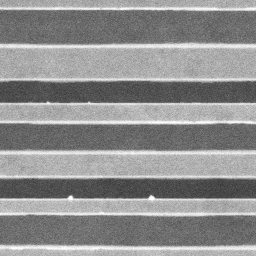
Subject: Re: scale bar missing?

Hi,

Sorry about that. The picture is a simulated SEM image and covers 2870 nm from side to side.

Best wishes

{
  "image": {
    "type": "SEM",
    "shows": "lines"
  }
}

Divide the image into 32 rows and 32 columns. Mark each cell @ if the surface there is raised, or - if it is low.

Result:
@@@@@@@@@@@@@@@@@@@@@@@@@@@@@@@@
--------------------------------
--------------------------------
--------------------------------
--------------------------------
--------------------------------
@@@@@@@@@@@@@@@@@@@@@@@@@@@@@@@@
@@@@@@@@@@@@@@@@@@@@@@@@@@@@@@@@
@@@@@@@@@@@@@@@@@@@@@@@@@@@@@@@@
@@@@@@@@@@@@@@@@@@@@@@@@@@@@@@@@
--------------------------------
--------------------------------
--------------------------------
@@@@@@@@@@@@@@@@@@@@@@@@@@@@@@@@
@@@@@@@@@@@@@@@@@@@@@@@@@@@@@@@@
--------------------------------
--------------------------------
--------------------------------
--------------------------------
@@@@@@@@@@@@@@@@@@@@@@@@@@@@@@@@
@@@@@@@@@@@@@@@@@@@@@@@@@@@@@@@@
@@@@@@@@@@@@@@@@@@@@@@@@@@@@@@@@
--------------------------------
--------------------------------
--------------------------------
@@@@@@@@@@@@@@@@@@@@@@@@@@@@@@@@
@@@@@@@@@@@@@@@@@@@@@@@@@@@@@@@@
--------------------------------
--------------------------------
--------------------------------
--------------------------------
@@@@@@@@@@@@@@@@@@@@@@@@@@@@@@@@